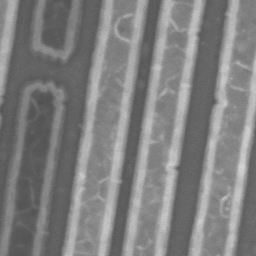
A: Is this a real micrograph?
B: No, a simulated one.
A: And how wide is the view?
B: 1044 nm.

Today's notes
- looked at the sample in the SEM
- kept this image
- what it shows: one or a few lines or trenches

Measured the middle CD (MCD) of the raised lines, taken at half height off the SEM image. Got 131 nanometers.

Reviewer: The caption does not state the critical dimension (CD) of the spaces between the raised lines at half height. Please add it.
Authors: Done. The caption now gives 134 nanometres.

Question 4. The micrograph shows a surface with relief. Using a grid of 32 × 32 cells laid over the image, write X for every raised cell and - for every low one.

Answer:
XX---XXXX-----XXXX---XXXX----XXX
X----XXXX-----XXX----XXXX----XXX
X----XXXX----XXXX----XXX-----XXX
X----XXXX----XXXX---XXXX-----XXX
X----XXXX----XXXX---XXXX-----XXX
X----XXXX----XXXX---XXXX-----XXX
------XX-----XXXX---XXXX----XXXX
------------XXXX----XXXX----XXXX
------------XXXX----XXX-----XXXX
------------XXXX---XXXX-----XXXX
------------XXXX---XXXX-----XXXX
---XXXX-----XXXX---XXXX-----XXXX
---XXXX-----XXXX---XXXX-----XXXX
---XXXX----XXXXX---XXXX-----XXXX
---XXXX----XXXXX---XXX-----XXXX-
---XXXX----XXXX----XXX-----XXXX-
---XXXX----XXXX---XXXX-----XXXX-
---XXXX----XXXX---XXXX-----XXXX-
--XXXXX----XXXX---XXXX-----XXXX-
--XXXX----XXXXX---XXXX----XXXX--
--XXXX----XXXX----XXX-----XXXX--
--XXXX----XXXX----XXX-----XXXX--
--XXXX----XXXX---XXXX-----XXXX--
-XXXXX----XXXX---XXXX-----XXXX--
-XXXXX----XXXX---XXXX-----XXXX--
-XXXX-----XXXX---XXXX----XXXXX--
-XXXX----XXXXX---XXXX----XXXX---
-XXXX----XXXX----XXXX----XXXX---
-XXXX----XXXX----XXX-----XXXX---
-XXXX----XXXX---XXXX-----XXXX---
-XXXX----XXXX---XXXX-----XXXX---
XXXXX----XXXX---XXXX----XXXXX---